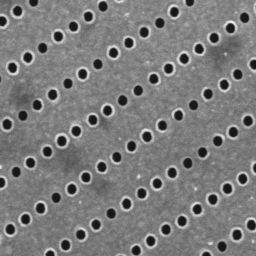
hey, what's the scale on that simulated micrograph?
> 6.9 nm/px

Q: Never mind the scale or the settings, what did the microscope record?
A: a regular array of holes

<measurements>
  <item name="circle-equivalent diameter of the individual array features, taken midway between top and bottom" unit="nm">67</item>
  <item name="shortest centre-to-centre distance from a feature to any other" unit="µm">0.125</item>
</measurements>